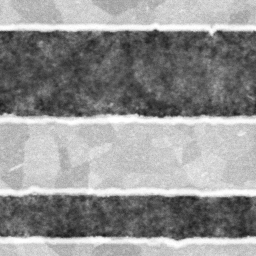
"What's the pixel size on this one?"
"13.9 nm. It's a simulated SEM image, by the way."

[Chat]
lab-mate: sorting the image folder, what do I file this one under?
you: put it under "one or a few lines or trenches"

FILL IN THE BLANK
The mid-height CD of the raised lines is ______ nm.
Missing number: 984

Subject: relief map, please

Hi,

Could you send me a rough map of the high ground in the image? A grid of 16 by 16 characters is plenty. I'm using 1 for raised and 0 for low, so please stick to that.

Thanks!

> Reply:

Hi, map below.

1111111111111111
1111111111111111
0000000000000000
0000000000000000
0000000000000000
0000000000000000
0000000000000000
0000000000000000
1111111111111111
1111111111111111
1111111111111111
1111111111111111
0000000000000000
0000000000000000
0000000000000000
1111111111111111